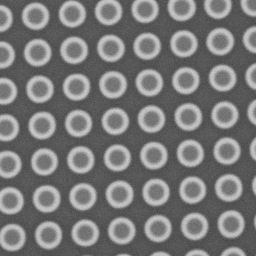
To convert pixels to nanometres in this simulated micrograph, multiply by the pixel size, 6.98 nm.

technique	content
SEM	an array of small figures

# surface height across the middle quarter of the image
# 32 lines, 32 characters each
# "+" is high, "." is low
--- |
................................
.....................+.......+++
..........++++.....+++++....++++
.+++++...++++++...++++++...+++++
++++++...+++++++..+++++++..+++++
++++++...+++++++..+++++++..+++++
++++++...++++++....+++++....++++
++++++....+++++.....+++.........
.++++...........................
................................
.............................+++
...........++++....+++++....++++
.+++++....++++++...++++++...++++
.++++++...++++++...++++++...++++
+++++++...++++++...++++++...++++
+++++++...++++++...++++++....+++
.++++++...+++++.....++++.......+
.+++++......++..................
................................
..............................++
............+++.....+++++....+++
..++++.....+++++...+++++++..++++
.++++++...++++++...+++++++..++++
.++++++...+++++++..+++++++..++++
.++++++...++++++....+++++....+++
.++++++....+++++....+++++......+
..++++......+++.................
................................
...............................+
.............++......++++.....++
...++++....+++++....++++++...+++
..++++++...++++++...++++++...+++